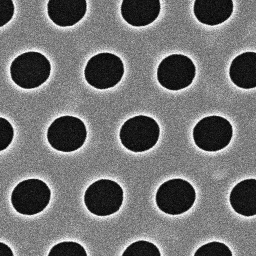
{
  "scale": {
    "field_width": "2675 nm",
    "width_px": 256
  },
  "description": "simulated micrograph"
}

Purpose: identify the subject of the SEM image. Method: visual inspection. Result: a regular array of holes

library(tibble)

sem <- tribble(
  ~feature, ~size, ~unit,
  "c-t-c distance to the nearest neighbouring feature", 0.748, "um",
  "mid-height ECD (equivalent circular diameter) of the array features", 38.4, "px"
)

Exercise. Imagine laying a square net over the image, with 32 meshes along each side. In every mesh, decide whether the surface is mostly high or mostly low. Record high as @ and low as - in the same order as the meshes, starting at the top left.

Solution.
--@@@@-----@@@@-----@@@@-----@@@
--@@@@-----@@@@-----@@@@-----@@@
-@@@@@----@@@@@@---@@@@@@---@@@@
@@@@@@@@@@@@@@@@@@@@@@@@@@@@@@@@
@@@@@@@@@@@@@@@@@@@@@@@@@@@@@@@@
@@@@@@@@@@@@@@@@@@@@@@@@@@@@@@@@
@@@--@@@@@@@@@@@@@@@@@@@@@@@@@@@
@@----@@@@@----@@@@@----@@@@@---
@-----@@@@@----@@@@@----@@@@@---
@-----@@@@@----@@@@@----@@@@@---
@@---@@@@@@----@@@@@----@@@@@---
@@@@@@@@@@@@@@@@@@@@@@@@@@@@@@@@
@@@@@@@@@@@@@@@@@@@@@@@@@@@@@@@@
@@@@@@@@@@@@@@@@@@@@@@@@@@@@@@@@
@@@@@@@@-@@@@@@@@-@@@@@@@@@@@@@@
-@@@@@-----@@@@-----@@@@@----@@@
--@@@@-----@@@@-----@@@@-----@@@
--@@@@-----@@@@-----@@@@-----@@@
-@@@@@@---@@@@@@---@@@@@@---@@@@
@@@@@@@@@@@@@@@@@@@@@@@@@@@@@@@@
@@@@@@@@@@@@@@@@@@@@@@@@@@@@@@@@
@@@@@@@@@@@@@@@@@@@@@@@@@@@@@@@@
@@@--@@@@@@@--@@@@@@@--@@@@@@@--
@@----@@@@@----@@@@@----@@@@@---
@-----@@@@@----@@@@-----@@@@@---
@@----@@@@@----@@@@@----@@@@@---
@@---@@@@@@---@@@@@@---@@@@@@@--
@@@@@@@@@@@@@@@@@@@@@@@@@@@@@@@@
@@@@@@@@@@@@@@@@@@@@@@@@@@@@@@@@
@@@@@@@@@@@@@@@@@@@@@@@@@@@@@@@@
-@@@@@@---@@@@@@---@@@@@@@--@@@@
--@@@@-----@@@@-----@@@@-----@@@